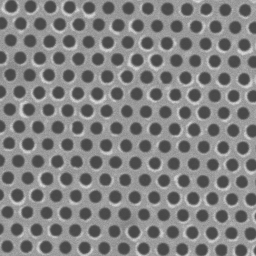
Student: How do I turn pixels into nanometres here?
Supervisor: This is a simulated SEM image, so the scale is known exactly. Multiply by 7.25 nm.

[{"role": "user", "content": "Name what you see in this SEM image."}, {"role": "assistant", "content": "a regular array of holes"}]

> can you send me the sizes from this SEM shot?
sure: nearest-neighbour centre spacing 138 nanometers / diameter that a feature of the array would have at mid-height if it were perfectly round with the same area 0.0899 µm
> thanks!